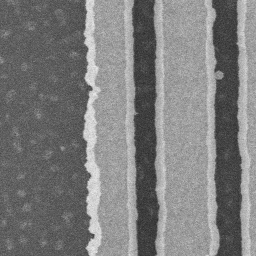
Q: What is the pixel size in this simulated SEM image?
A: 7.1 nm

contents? one or a few lines or trenches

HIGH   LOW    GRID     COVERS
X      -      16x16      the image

------XX--XXX--X
------XX--XXX--X
------XX--XXX--X
------XX--XXX--X
------XX--XXX--X
------XX--XXX--X
------XX--XXX--X
------XX--XXX--X
------XX--XXX--X
------XX--XXX--X
------XX--XXX--X
------XX--XXX--X
------XX--XXX--X
------XX--XXX--X
------XX--XXX--X
------XX--XXX--X